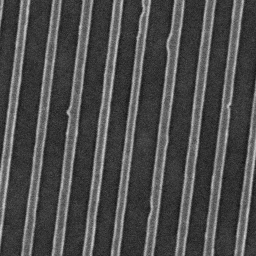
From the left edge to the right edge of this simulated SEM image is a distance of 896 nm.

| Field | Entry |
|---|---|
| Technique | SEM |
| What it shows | parallel lines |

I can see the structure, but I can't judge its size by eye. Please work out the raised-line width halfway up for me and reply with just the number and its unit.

30.8 nm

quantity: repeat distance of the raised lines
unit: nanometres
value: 106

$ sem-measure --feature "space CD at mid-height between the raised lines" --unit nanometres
74.8